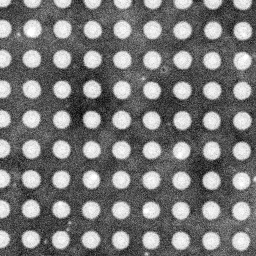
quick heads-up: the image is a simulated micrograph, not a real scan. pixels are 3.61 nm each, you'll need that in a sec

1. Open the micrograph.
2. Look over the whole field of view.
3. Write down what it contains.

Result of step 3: an array of small figures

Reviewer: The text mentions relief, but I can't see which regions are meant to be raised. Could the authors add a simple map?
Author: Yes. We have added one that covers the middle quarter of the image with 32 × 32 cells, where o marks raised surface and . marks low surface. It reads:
o.....oo.....ooo.....ooo....ooo.
................................
................................
................................
......oo......o.................
o....oooo....ooo....oooo....ooo.
oo...oooo...oooo....oooo....oooo
o....oooo....ooo....oooo....oooo
..............o......oo......oo.
................................
................................
................................
o....oooo....ooo.....oo.....ooo.
o....oooo...ooooo...oooo....oooo
o....oooo...ooooo...oooo....oooo
o.....oo.....ooo....oooo....ooo.
................................
................................
................................
..............o.................
o....oooo...oooo....oooo....ooo.
o....oooo...oooo....oooo...oooo.
o....oooo...oooo....oooo...oooo.
..............o......oo.....ooo.
................................
................................
................................
o....ooo.....ooo....ooo.....ooo.
o....oooo...oooo....oooo...oooo.
o....oooo...oooo....oooo...oooo.
o.....oo.....ooo....ooo.....ooo.
................................